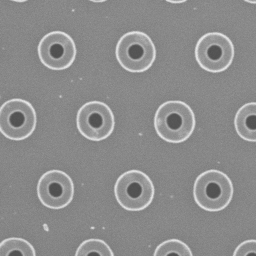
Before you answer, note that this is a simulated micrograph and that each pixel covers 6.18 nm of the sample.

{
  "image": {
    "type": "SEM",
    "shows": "a regular array of ring-shaped raised bodies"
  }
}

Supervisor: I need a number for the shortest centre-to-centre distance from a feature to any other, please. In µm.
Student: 0.487